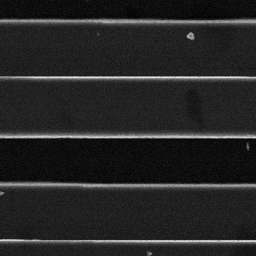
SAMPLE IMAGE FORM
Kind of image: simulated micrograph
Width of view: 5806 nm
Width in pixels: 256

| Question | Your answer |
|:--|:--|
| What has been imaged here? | lines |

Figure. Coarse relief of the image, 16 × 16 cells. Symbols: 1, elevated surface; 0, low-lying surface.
0000000000000000
1111111111111111
1111111111111111
1111111111111111
1111111111111111
1111111111111111
1111111111111111
1111111111111111
1111111111111111
0000000000000000
0000000000000000
0000000000000000
1111111111111111
1111111111111111
1111111111111111
1111111111111111